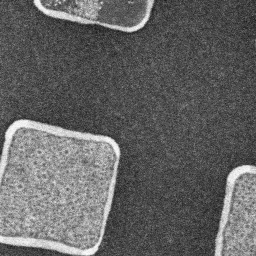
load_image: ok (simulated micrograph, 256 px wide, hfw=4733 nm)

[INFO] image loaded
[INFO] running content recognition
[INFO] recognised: raised bodies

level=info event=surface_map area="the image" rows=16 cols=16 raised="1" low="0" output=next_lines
0001111110000000
0000000110000000
0000000000000000
0000000000000000
0000000000000000
0000000000000000
0000000000000000
0000000000000000
1111100000000000
1111111000000000
1111111000000000
1111111000000011
1111111000000011
1111111000000011
1111110000000011
0000110000000011